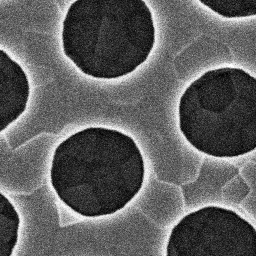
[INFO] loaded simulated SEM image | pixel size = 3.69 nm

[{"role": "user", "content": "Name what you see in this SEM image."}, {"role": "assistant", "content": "holes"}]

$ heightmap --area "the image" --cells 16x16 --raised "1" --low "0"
1111000001111000
1111000000111111
1111000000111111
0111000001111111
0111100011111001
0011111111110000
0011111111100000
0111111111100000
1111000011110000
1110000001111000
1110000001111111
1110000001111111
1111000011111111
0111101111110001
0111111111100000
0111111111000000